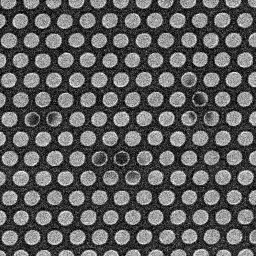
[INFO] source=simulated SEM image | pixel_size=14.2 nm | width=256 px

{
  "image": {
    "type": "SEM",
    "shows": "a regular array of raised bodies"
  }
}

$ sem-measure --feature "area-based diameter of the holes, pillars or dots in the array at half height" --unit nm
209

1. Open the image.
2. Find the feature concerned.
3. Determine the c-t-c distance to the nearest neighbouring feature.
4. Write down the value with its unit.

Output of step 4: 315 nm